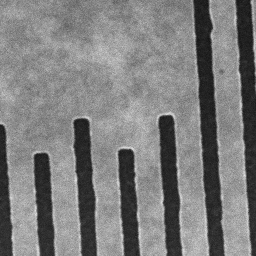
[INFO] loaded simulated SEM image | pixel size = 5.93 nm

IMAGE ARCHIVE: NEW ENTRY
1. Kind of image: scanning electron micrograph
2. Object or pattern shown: parallel lines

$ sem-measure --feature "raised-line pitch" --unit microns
0.25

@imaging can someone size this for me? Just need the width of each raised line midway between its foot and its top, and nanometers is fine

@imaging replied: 149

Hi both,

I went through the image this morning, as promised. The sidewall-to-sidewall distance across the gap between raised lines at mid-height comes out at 101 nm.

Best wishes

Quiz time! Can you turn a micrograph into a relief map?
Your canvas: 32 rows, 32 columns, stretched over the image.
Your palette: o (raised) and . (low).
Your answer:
oooooooooooooooooooooooo..ooo..o
oooooooooooooooooooooooo..ooo...
oooooooooooooooooooooooo...oo...
oooooooooooooooooooooooo...ooo..
oooooooooooooooooooooooo..oooo..
oooooooooooooooooooooooo...ooo..
oooooooooooooooooooooooo...ooo..
ooooooooooooooooooooooooo..ooo..
ooooooooooooooooooooooooo..ooo..
ooooooooooooooooooooooooo..ooo..
ooooooooooooooooooooooooo..ooo..
ooooooooooooooooooooooooo..ooo..
ooooooooooooooooooooooooo..ooo..
ooooooooooooooooooooooooo..ooo..
oooooooooooooooooooo..ooo..ooo..
ooooooooo..ooooooooo..ooo..ooo..
.oooooooo..ooooooooo..ooo..ooo..
.oooooooo..ooooooooo..ooo..ooo..
.oooooooo..ooooooooo..ooo..oooo.
.ooo..ooo..oooo..ooo..ooo..oooo.
.ooo..ooo...ooo..ooo..ooo..oooo.
.ooo..ooo...ooo..ooo..ooo..oooo.
.ooo..oooo..ooo..ooo..ooo...ooo.
.ooo...ooo..ooo..ooo..ooo...ooo.
.ooo...ooo..ooo..ooo...ooo..ooo.
.ooo...ooo..ooo..ooo...ooo..ooo.
.ooo...ooo..ooo..oooo..ooo..ooo.
..ooo..ooo..ooo..ooo...ooo..ooo.
..ooo..ooo..ooo..oooo..ooo..ooo.
..ooo..ooo..ooo..oooo..ooo..ooo.
..ooo..ooo..ooo..oooo..ooo..ooo.
..ooo..ooo..ooo...ooo..ooo..ooo.